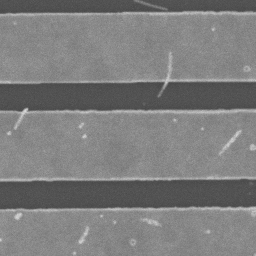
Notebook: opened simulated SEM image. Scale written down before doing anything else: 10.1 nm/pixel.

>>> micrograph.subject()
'lines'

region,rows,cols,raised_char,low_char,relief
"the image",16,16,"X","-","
----------------
XXXXXXXXXXXXXXXX
XXXXXXXXXXXXXXXX
XXXXXXXXXXXXXXXX
XXXXXXXXXXXXXXXX
----------------
----------------
XXXXXXXXXXXXXXXX
XXXXXXXXXXXXXXXX
XXXXXXXXXXXXXXXX
XXXXXXXXXXXXXXXX
----------------
----------------
XXXXXXXXXXXXXXXX
XXXXXXXXXXXXXXXX
XXXXXXXXXXXXXXXX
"